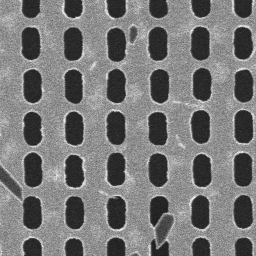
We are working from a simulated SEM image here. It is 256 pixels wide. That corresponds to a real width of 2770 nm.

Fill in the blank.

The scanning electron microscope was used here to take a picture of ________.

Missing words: a regular array of holes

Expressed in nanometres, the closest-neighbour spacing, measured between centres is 448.